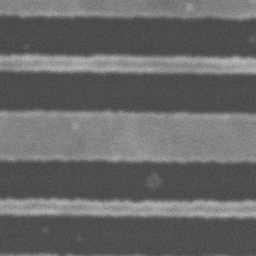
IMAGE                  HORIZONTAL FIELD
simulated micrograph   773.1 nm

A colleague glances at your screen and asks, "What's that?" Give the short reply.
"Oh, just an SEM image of lines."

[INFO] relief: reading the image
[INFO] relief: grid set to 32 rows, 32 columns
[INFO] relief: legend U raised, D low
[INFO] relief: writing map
UUUUUUUUUUUUUUUUUUUUUUUUUUUUUUUU
UUUUUUUUUUUUUUUUUUUUUUUUUUUUUUUU
DDDDDDDDDDDDDDDDDDDDDDDDDDDDDDDD
DDDDDDDDDDDDDDDDDDDDDDDDDDDDDDDD
DDDDDDDDDDDDDDDDDDDDDDDDDDDDDDDD
DDDDDDDDDDDDDDDDDDDDDDDDDDDDDDDD
DDDDDDDDDDDDDDDDDDDDDDDDDDDDDDDD
UUUUUUUUUUUUUUUUUUUUUUUUUUUUUUUU
UUUUUUUUUUUUUUUUUUUUUUUUUUUUUUUU
DDDDDDDDDDDDDDDDDDDDDDDDDDDDDDDD
DDDDDDDDDDDDDDDDDDDDDDDDDDDDDDDD
DDDDDDDDDDDDDDDDDDDDDDDDDDDDDDDD
DDDDDDDDDDDDDDDDDDDDDDDDDDDDDDDD
DDDDDDDDDDDDDDDDDDDDDDDDDDDDDDDD
UUUUUUUUUUUUUUUUUUUUUUUUUUUUUUUU
UUUUUUUUUUUUUUUUUUUUUUUUUUUUUUUU
UUUUUUUUUUUUUUUUUUUUUUUUUUUUUUUU
UUUUUUUUUUUUUUUUUUUUUUUUUUUUUUUU
UUUUUUUUUUUUUUUUUUUUUUUUUUUUUUUU
UUUUUUUUUUUUUUUUUUUUUUUUUUUUUUUU
DDDDDDDDDDDDDDDDDDDDDDDDDDDDDDDD
DDDDDDDDDDDDDDDDDDDDDDDDDDDDDDDD
DDDDDDDDDDDDDDDDDDDDDDDDDDDDDDDD
DDDDDDDDDDDDDDDDDDDDDDDDDDDDDDDD
DDDDDDDDDDDDDDDDDDDDDDDDDDDDDDDD
UUUUUUUUUUUUUUUUUUUUUUUUUUUUUUUU
UUUUUUUUUUUUUUUUUUUUUUUUUUUUUUUU
DDDDDDDDDDDDDDDDDDDDDDDDDDDDDDDD
DDDDDDDDDDDDDDDDDDDDDDDDDDDDDDDD
DDDDDDDDDDDDDDDDDDDDDDDDDDDDDDDD
DDDDDDDDDDDDDDDDDDDDDDDDDDDDDDDD
DDDDDDDDDDDDDDDDDDDDDDDDDDDDDDDD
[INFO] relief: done